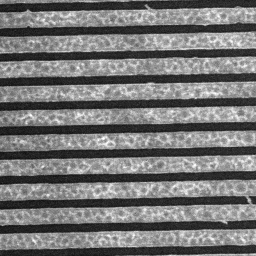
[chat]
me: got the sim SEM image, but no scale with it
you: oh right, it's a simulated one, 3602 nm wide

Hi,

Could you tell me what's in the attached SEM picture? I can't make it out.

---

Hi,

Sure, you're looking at parallel lines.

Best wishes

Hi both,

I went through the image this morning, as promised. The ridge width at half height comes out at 218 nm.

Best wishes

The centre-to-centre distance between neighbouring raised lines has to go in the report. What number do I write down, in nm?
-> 346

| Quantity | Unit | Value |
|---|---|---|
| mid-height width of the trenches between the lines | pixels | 9.12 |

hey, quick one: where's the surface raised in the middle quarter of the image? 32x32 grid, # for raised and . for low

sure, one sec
################################
################################
#####################...........
................................
................................
.###...#########################
################################
################################
############################....
................................
................................
...#############################
################################
################################
################################
................................
................................
...........#####################
################################
################################
################################
................................
................................
...................#############
################################
################################
################################
................................
................................
...........................#####
################################
################################